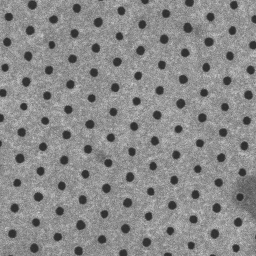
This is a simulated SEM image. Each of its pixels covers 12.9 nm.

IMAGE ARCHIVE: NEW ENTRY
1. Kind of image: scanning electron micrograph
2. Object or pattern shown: a regular array of holes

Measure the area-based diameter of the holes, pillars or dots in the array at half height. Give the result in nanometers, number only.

111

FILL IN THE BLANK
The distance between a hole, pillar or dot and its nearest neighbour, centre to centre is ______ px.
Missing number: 25.1